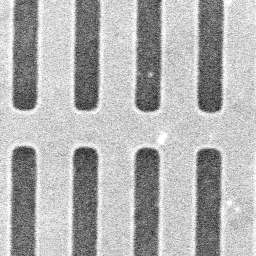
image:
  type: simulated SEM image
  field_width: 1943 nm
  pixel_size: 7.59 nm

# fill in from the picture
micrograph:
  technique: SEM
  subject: groups of lines, slits or small figures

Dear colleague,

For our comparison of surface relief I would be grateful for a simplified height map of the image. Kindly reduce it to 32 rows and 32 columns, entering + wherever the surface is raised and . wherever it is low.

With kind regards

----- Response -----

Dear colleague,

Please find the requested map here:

++...++++....++++...+++++...++++
+....++++....++++...+++++...++++
+....++++....++++...+++++...++++
+....++++....++++...+++++...++++
+....++++....++++...+++++...++++
+....++++....++++...+++++...++++
+....++++....++++...+++++...++++
+....++++....++++...+++++...++++
+....++++....++++...+++++...++++
+....++++....++++...+++++...++++
+....++++...+++++...+++++...++++
+....++++...+++++...+++++...++++
+....++++...+++++...+++++...++++
++..+++++...+++++...+++++...++++
++++++++++++++++++++++++++++++++
++++++++++++++++++++++++++++++++
++++++++++++++++++++++++++++++++
++++++++++++++++++++++++++++++++
++..++++++..++++++.+++++++.+++++
+....++++...+++++...++++....++++
+....++++...+++++...++++....++++
+....++++...+++++...++++....++++
+....++++...+++++...++++....++++
+....++++...+++++...++++....++++
+....++++...+++++...++++....++++
+....++++...+++++...++++....++++
+....++++...+++++...++++....++++
+....++++...+++++...++++....++++
+....++++...+++++...++++....++++
+....++++...+++++...++++....++++
+....++++...++++....++++....++++
+....++++...++++....++++....++++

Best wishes